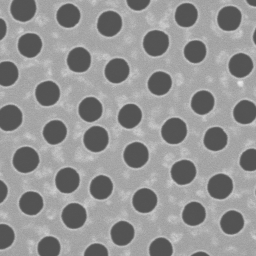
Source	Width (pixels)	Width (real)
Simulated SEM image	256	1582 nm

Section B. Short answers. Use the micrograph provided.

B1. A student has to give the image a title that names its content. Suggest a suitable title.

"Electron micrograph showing a regular array of holes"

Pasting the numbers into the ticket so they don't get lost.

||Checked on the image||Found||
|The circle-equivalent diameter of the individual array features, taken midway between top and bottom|152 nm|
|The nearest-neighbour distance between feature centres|244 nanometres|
